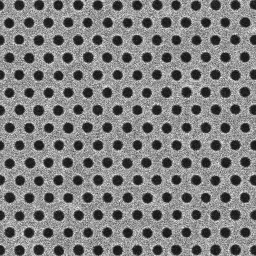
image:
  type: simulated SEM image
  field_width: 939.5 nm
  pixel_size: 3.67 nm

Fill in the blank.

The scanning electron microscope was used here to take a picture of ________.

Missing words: a regular array of holes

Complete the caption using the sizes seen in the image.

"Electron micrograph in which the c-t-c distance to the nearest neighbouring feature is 0.0712 um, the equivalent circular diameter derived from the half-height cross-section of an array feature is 36.3 nanometres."